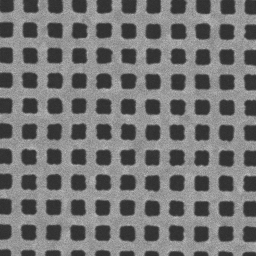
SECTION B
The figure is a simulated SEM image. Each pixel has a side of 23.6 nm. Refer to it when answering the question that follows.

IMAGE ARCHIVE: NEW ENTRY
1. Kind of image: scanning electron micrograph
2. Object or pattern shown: a regular array of holes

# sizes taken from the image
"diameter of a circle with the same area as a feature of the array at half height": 403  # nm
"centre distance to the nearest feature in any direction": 24.4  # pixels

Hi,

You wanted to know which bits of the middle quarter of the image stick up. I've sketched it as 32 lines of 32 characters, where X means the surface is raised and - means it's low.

XXXXXXXXXXXXXXXXXXXXXXXXXXXXXXXX
XXXXXXXXXXXXXXXXXXXXXXXXXXXXXXXX
XX---XXXX--XXXX---XXX--XXXXX-XXX
XX----XX----XX----XX----XXX----X
XX----XX----XX----XX----XXX---XX
XX----XX----XX----XX----XXX---XX
XXXXXXXXXXXXXXXXXXXXX--XXXX---XX
XXXXXXXXXXXXXXXXXXXXXXXXXXXXXXXX
XXX--XXXX-XXXXXXXXXXXXXXXXXXXXXX
XX----XX----XX----XX----XXX---XX
XX----XX----XX----XX----XX-----X
XX----XX----XX----XX----XX-----X
XXXXXXXXX--XXXX---XXX---XXX---XX
XXXXXXXXXXXXXXXXXXXXXXXXXXXXXXXX
XXXXXXXXXXXXXXXXXXXXXXXXXXXXXXXX
XX----XX----XX----XXX---XXX---XX
XX----XX----XX----XX----XX----XX
XX----XX----XX----XX----XX----XX
XX---XXX----XX----XX----XXX---XX
XXXXXXXXXXXXXXXXXXXXXXXXXXXXXXXX
XXXXXXXXXXXXXXXXXXXXXXXXXXXXXXXX
XX---XXXX--XXXXX--XXX---XXX---XX
XX----XX----XX----XX----XX----XX
XX----XX----XX----XX----XX----XX
XX----XX----XX----XX----XX----XX
XXXXXXXXXXXXXXXXXXXXXXXXXXX-XXXX
XXXXXXXXXXXXXXXXXXXXXXXXXXXXXXXX
XXXXXXXXXXXXXXXXXXXXXXXXXXXXXXXX
XX---XXX----XX----XX----XXX---XX
XX---XXX----XX----XX----XX----XX
XX----XX----XX----XX----XX----XX
XX---XXX---XXX---XXXX---XXX---XX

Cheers